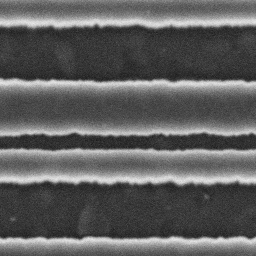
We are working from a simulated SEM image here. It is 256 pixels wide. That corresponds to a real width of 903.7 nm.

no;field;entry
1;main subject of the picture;lines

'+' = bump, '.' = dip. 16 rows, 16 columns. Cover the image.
++++++++++++++++
..+++....+++....
................
................
................
++++++++++++++++
++++++++++++++++
++++++++++++++++
++++++++++++++++
++++++++++++++++
++++++++++++++++
................
................
................
................
++++++++++++++++